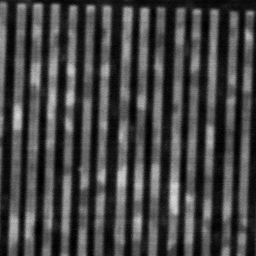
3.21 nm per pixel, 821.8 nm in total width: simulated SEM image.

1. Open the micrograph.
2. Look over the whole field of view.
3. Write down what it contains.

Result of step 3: parallel lines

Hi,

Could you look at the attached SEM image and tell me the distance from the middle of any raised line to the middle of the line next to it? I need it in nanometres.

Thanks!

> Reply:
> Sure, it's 56.4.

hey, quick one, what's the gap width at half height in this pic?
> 9.97 px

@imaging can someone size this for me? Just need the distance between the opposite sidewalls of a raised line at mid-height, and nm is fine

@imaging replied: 23.6